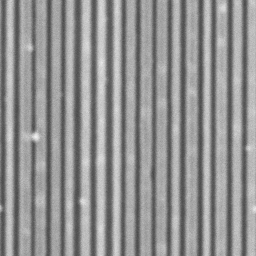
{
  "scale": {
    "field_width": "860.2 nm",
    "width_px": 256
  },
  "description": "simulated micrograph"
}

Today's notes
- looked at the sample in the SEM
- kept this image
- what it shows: parallel lines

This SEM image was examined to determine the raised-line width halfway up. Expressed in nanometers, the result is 28.5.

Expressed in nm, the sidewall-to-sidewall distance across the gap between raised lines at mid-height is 20.1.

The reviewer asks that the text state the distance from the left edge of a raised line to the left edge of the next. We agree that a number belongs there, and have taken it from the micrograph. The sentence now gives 50.9 nm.